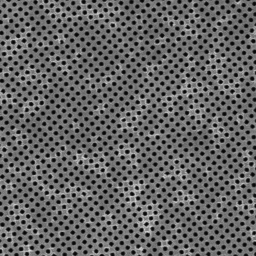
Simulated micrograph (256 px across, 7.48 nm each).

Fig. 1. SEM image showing a regular array of holes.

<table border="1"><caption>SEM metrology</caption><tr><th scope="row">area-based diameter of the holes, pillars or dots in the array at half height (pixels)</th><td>4.52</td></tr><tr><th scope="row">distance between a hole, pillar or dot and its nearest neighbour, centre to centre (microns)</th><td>0.054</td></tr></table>